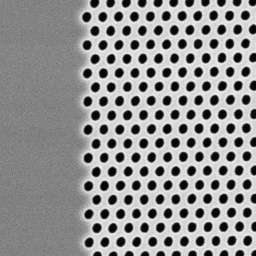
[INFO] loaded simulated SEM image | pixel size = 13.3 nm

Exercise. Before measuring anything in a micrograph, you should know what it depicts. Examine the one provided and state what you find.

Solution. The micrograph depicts a regular array of holes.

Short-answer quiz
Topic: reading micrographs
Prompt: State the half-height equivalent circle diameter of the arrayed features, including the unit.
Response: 9.83 pixels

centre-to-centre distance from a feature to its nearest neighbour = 208 nanometers